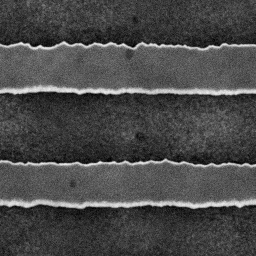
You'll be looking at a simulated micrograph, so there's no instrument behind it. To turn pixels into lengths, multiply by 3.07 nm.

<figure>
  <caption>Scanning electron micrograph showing lines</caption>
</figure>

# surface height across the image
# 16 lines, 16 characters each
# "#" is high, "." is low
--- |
................
................
................
################
################
################
................
................
................
................
################
################
################
................
................
................